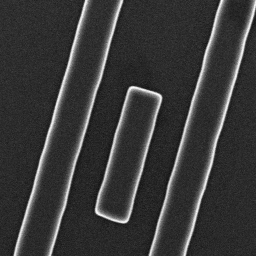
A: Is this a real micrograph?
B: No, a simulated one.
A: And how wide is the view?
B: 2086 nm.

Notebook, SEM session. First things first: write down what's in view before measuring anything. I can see groups of lines, slits or small figures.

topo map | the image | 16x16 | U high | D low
DDDDDUUDDDDDDDUU
DDDDDUUDDDDDDUUU
DDDDDUUDDDDDDUUD
DDDDUUUDDDDDDUUD
DDDDUUDDDDDDDUUD
DDDDUUDDDDDDUUUD
DDDDUUDDUUDDUUDD
DDDUUDDDUUDDUUDD
DDDUUDDUUDDUUUDD
DDDUUDDUUDDUUDDD
DDUUUDDUUDDUUDDD
DDUUDDUUUDDUUDDD
DDUUDDUUDDUUUDDD
DDUUDDUUDDUUDDDD
DUUUDDDDDDUUDDDD
DUUDDDDDDUUUDDDD